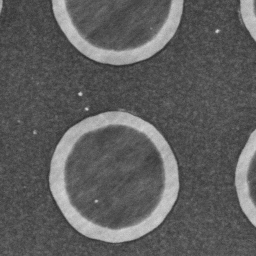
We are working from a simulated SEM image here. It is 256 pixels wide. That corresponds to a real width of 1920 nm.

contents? raised bodies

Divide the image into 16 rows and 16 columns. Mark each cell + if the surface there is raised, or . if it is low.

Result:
....+++++++....+
....+++++++.....
.....+++++......
......+++.......
................
................
................
......++........
.....+++++......
....++++++.....+
....+++++++....+
....+++++++....+
....+++++++....+
.....+++++......
......+++.......
................